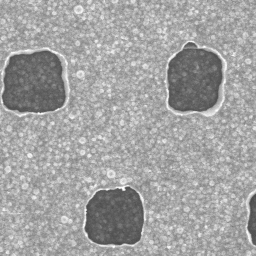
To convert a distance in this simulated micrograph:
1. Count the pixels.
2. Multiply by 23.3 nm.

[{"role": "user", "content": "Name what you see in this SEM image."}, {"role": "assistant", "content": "holes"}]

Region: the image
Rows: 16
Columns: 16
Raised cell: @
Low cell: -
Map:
@@@@@@@@@@@@@@@@
@@@@@@@@@@@@@@@@
@@@@@@@@@@@@@@@@
@---@@@@@@@---@@
----@@@@@@----@@
----@@@@@@----@@
----@@@@@@@---@@
@@@@@@@@@@@@@@@@
@@@@@@@@@@@@@@@@
@@@@@@@@@@@@@@@@
@@@@@@@@@@@@@@@@
@@@@@@@@@@@@@@@@
@@@@@@---@@@@@@@
@@@@@----@@@@@@@
@@@@@----@@@@@@@
@@@@@@@@@@@@@@@@